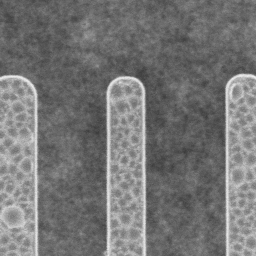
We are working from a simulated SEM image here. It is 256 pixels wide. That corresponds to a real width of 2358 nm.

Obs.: one or a few lines or trenches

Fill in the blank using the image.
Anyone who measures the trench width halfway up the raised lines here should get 746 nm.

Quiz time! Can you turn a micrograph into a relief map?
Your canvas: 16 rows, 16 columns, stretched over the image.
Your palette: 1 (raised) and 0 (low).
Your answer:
0000000000000000
0000000000000000
0000000000000000
0000000000000000
0000000000000000
1100000110000011
1100000110000011
1100000110000011
1100000110000011
1100000110000011
1100000110000011
1100000110000011
1100000110000011
1100000110000011
1100000110000011
1100000110000011